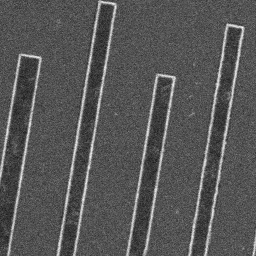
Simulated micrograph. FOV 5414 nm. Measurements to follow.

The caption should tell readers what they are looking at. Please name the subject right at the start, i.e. one or a few lines or trenches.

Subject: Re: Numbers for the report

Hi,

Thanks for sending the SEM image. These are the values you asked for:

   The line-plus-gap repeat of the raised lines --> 1380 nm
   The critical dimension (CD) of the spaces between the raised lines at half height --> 1030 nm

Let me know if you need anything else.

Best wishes